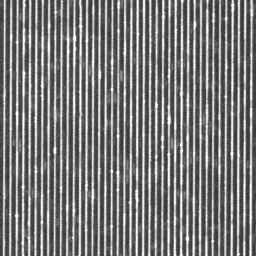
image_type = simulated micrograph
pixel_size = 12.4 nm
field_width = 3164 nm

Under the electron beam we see parallel lines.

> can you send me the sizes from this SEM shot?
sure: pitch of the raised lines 78.2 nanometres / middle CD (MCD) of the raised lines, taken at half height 13.9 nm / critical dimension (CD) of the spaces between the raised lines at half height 0.0633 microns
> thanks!